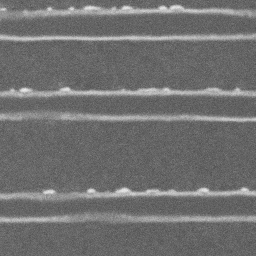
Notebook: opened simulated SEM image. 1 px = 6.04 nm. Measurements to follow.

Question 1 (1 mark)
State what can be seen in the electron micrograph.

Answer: lines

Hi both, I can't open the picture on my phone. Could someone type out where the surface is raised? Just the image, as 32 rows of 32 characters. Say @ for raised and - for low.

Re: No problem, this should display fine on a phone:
--------------------------------
------@@@@@@@@@@@@@@@@@@@@@@@@@@
@@@@@@@@@@@@@@@@@@@@@@@@@@@@@@@@
@@@@@@@@@@@@@@@@@@@@@@@@@@@@@@@@
@@@@@@@@@@@@@@@@@@@@@@@@@@@@@@@@
--------------------------------
--------------------------------
--------------------------------
--------------------------------
--------------------------------
--------------------------------
--@@---@@--------@@@@@@-@@@@-@--
@@@@@@@@@@@@@@@@@@@@@@@@@@@@@@@@
@@@@@@@@@@@@@@@@@@@@@@@@@@@@@@@@
@@@@@@@@@@@@@@@@@@@@@@@@@@@@@@@@
--------------------------------
--------------------------------
--------------------------------
--------------------------------
--------------------------------
--------------------------------
--------------------------------
--------------------------------
--------------------------------
@@@@@@@@@@@@@@@@@@@@@@@@@@@@@@@@
@@@@@@@@@@@@@@@@@@@@@@@@@@@@@@@@
@@@@@@@@@@@@@@@@@@@@@@@@@@@@@@@@
@@@@@@@---------@@--------@@@--@
--------------------------------
--------------------------------
--------------------------------
--------------------------------